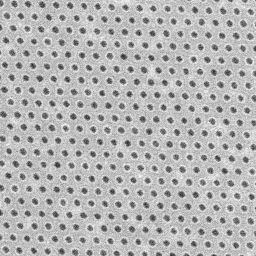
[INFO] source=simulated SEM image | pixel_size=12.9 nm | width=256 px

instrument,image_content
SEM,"a regular array of holes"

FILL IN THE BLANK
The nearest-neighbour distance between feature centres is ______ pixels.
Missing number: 13.7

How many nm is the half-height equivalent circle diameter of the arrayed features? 95.5